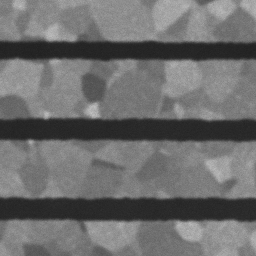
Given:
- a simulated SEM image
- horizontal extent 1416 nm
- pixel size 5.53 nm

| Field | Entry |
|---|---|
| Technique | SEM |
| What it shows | lines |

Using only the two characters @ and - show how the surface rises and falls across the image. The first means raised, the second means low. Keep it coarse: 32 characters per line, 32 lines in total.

@@@@@@@@@@@@@@@@@@@@@@@@@@@@@@@@
@@@@@@@@@@@@@@@@@@@@@@@@@@@@@@@@
@@@@@@@@@@@@@@@@@@@@@@@@@@@@@@@@
@@@@@@@@@@@@@@@@@@@@@@@@@@@@@@@@
@@@@@@@@@@@@@@@@@@@@@@@@@@@@@@@@
--------------------------------
--------------------------------
-@@-@-@@@@@-----@-------------@-
@@@@@@@@@@@@@@@@@@@@@@@@@@@@@@@@
@@@@@@@@@@@@@@@@@@@@@@@@@@@@@@@@
@@@@@@@@@@@@@@@@@@@@@@@@@@@@@@@@
@@@@@@@@@@@@@@@@@@@@@@@@@@@@@@@@
@@@@@@@@@@@@@@@@@@@@@@@@@@@@@@@@
@@@@@@@@@@@@@@@@@@@@@@@@@@@@@@@@
@@@@@@@@@@@@@@@@@@@@@@@@@@@@@@@@
--------------------------------
--------------------------------
---------@----------------------
@@@@@@@@@@@@@@@@@@@@@@@@@@@@@@@@
@@@@@@@@@@@@@@@@@@@@@@@@@@@@@@@@
@@@@@@@@@@@@@@@@@@@@@@@@@@@@@@@@
@@@@@@@@@@@@@@@@@@@@@@@@@@@@@@@@
@@@@@@@@@@@@@@@@@@@@@@@@@@@@@@@@
@@@@@@@@@@@@@@@@@@@@@@@@@@@@@@@@
@@@@@@@@@@@@@@@@@@@@@@@@@@@@@@@@
--------------------------------
--------------------------------
--------@-----------------------
@@@@@@@@@@@@@@@@@@@@@@@@@@@@@@@@
@@@@@@@@@@@@@@@@@@@@@@@@@@@@@@@@
@@@@@@@@@@@@@@@@@@@@@@@@@@@@@@@@
@@@@@@@@@@@@@@@@@@@@@@@@@@@@@@@@